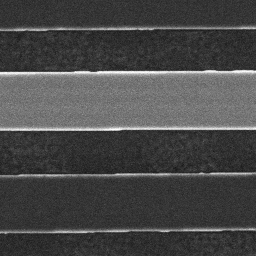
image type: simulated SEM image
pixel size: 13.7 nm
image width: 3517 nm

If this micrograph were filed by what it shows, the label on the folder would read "lines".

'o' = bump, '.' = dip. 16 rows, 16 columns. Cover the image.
oooooooooooooooo
oooooooooooooooo
................
................
.....ooooooooooo
oooooooooooooooo
oooooooooooooooo
oooooooooooooooo
................
................
................
oooooooooooooooo
oooooooooooooooo
oooooooooooooooo
oooooo..........
................